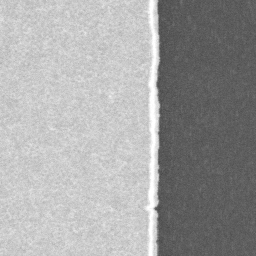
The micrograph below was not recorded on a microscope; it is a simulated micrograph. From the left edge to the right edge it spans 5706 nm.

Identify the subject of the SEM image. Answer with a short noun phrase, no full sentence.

one or a few lines or trenches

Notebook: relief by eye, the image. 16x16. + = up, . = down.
+++++++++.......
+++++++++.......
++++++++++......
++++++++++......
++++++++++......
++++++++++......
++++++++++......
++++++++++......
++++++++++......
++++++++++......
++++++++++......
+++++++++.......
+++++++++.......
+++++++++.......
+++++++++.......
+++++++++.......